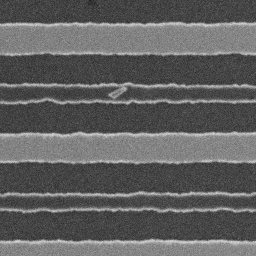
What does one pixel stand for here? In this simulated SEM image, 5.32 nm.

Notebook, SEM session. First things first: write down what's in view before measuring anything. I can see lines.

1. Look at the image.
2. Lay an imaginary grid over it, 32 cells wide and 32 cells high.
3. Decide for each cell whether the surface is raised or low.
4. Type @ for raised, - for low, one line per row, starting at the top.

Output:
--------------------------------
--------------------------------
--------------------------------
@@@@@@@@@@@@@@@@@@@@@@@@@@@@@@@@
@@@@@@@@@@@@@@@@@@@@@@@@@@@@@@@@
@@@@@@@@@@@@@@@@@@@@@@@@@@@@@@@@
@@@@@@@@@@@@@@@@@@@@@@@@@@@@@@@@
--------------------------------
--------------------------------
--------------------------------
--------------------------------
@@@@@@@@@@@@@@@@@@@@@@@@@@@@@@@@
@@@@@@@@@@@@@@@@@@@@@@@@@@@@@@@@
--------------------------------
--------------------------------
--------------------------------
--------------------------------
@@@@@@@@@@@@@@@@@@@@@@@@@@@@@@@@
@@@@@@@@@@@@@@@@@@@@@@@@@@@@@@@@
@@@@@@@@@@@@@@@@@@@@@@@@@@@@@@@@
--------------------------------
--------------------------------
--------------------------------
--------------------------------
@@@@@@@@@@@@@@@@@@@@@@@@@@@@@@@@
@@@@@@@@@@@@@@@@@@@@@@@@@@@@@@@@
---@----------------------------
--------------------------------
--------------------------------
--------------------------------
@@@@@@@@@@@@@@@@@@@@@@@@@@@@@@@@
@@@@@@@@@@@@@@@@@@@@@@@@@@@@@@@@